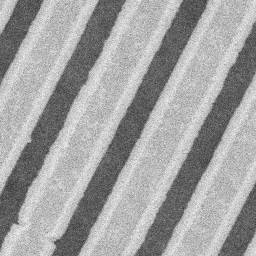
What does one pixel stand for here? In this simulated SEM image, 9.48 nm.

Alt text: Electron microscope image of one or a few lines or trenches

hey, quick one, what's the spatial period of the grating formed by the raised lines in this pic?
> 700 nm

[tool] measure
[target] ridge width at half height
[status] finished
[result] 370 nanometres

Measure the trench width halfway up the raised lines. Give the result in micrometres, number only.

0.329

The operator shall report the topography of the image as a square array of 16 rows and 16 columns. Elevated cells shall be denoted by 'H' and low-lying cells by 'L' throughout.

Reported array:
LLLHHHLLHHHLLHHH
LLHHHLLLHHLLLHHL
LLHHHLLHHHLLHHHL
LHHHLLLHHLLLHHLL
LHHHLLHHHLLHHHLL
HHHLLLHHLLLHHLLL
HHHLLHHHLLHHHLLH
HHLLLHHLLLHHLLLH
HHLLHHHLLHHHLLHH
HLLHHHLLLHHLLLHH
LLLHHHLLHHHLLHHH
LLHHHLLLHHLLLHHH
LLHHHLLHHHLLHHHL
LHHHLLLHHLLLHHLL
LHHHLLHHHLLHHHLL
HHHLLLHHLLLHHLLL